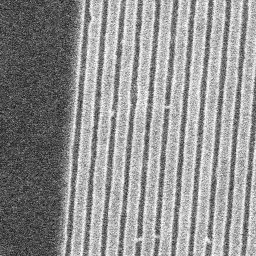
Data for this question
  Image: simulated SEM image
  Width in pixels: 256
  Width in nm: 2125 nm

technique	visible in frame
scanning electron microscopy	parallel lines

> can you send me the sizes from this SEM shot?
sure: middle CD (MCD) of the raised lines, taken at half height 0.0879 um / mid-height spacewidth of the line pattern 55.9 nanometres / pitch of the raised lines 145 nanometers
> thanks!